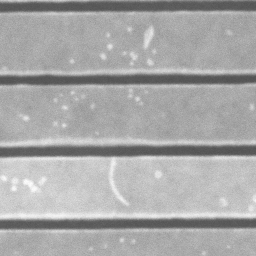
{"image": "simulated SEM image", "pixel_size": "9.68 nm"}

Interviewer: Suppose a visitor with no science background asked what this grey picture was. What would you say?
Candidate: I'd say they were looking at lines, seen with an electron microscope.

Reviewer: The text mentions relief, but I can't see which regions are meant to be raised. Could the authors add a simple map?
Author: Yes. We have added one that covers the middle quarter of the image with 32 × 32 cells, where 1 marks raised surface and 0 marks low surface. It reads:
11111111111111111111111111111111
11111111111111111111111111111111
11111111111111111110111000000111
00000000000000000000000000000000
00000000000000000000000000000000
01011111111111111111111111111111
11111111111111111111111111111111
11111111111111111111111111111111
11111111111111111111111111111111
11111111111111111111111111111111
11111111111111111111111111111111
11111111111111111111111111111111
11111111111111111111111111111111
11111111111111111111111111111111
11111111111111111111111111111111
11111111111111111111111111111111
11111111111111111111111111111111
11111111111111111111111111111111
11111111111111111111111111111111
11111111111111111111111111111111
00000000010000000000000100000000
00000000000000000000000000000000
00000000000000000000000000000000
11111111111111111111111111111111
11111111111111111111111111111111
11111111111111111111111111111111
11111111111111111111111111111111
11111111111111111111111111111111
11111111111111111111111111111111
11111111111111111111111111111111
11111111111111111111111111111111
11111111111111111111111111111111